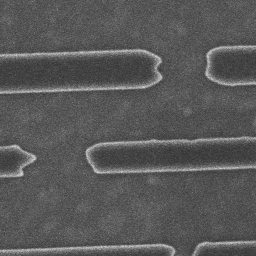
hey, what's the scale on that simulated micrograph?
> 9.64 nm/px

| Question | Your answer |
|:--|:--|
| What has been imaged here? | one or a few lines or trenches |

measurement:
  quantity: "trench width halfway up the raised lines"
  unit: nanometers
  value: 702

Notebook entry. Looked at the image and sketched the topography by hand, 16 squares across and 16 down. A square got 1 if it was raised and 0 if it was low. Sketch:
0000000000000000
0000000000000000
0000000000000000
1111111111000111
1111111111000111
1111111110000000
0000000000000000
0000000000000000
0000000000000000
1100001111111111
1100001111111110
0000000000000000
0000000000000000
0000000000000000
0000000000000000
0000111111101111